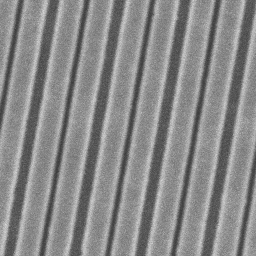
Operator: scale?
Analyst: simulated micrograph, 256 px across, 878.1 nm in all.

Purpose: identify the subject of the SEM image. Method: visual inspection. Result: parallel lines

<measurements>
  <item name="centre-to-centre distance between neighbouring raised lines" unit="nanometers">111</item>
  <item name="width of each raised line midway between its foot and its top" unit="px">22.2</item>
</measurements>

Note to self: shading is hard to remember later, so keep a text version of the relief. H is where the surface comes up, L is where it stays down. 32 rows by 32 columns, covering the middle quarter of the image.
HHLLHHHHHLLLLHHHHHLLHHHHHHLLLHHH
HHLLHHHHHLLLLHHHHHLLHHHHHHLLLHHH
HLLLHHHHHLLLLHHHHHLLHHHHHLLLLHHH
HLLHHHHHHLLLHHHHHHLLHHHHHLLLLHHH
HLLHHHHHLLLLHHHHHHLLHHHHHLLLLHHH
HLLHHHHHLLLLHHHHHLLLHHHHHLLLHHHH
HLLHHHHHLLLLHHHHHLLHHHHHHLLLHHHH
LLLHHHHHLLLLHHHHHLLHHHHHLLLLHHHH
LLHHHHHHLLLLHHHHHLLHHHHHLLLLHHHH
LLHHHHHHLLLHHHHHHLLHHHHHLLLLHHHH
LLHHHHHLLLLHHHHHLLLHHHHHLLLHHHHH
LLHHHHHLLLLHHHHHLLHHHHHHLLLHHHHH
LLHHHHHLLLLHHHHHLLHHHHHHLLLHHHHH
LLHHHHHLLLHHHHHHLLHHHHHLLLLHHHHH
LHHHHHHLLLHHHHHHLLHHHHHLLLLHHHHH
LHHHHHHLLLHHHHHHLLHHHHHLLLLHHHHH
LHHHHHLLLLHHHHHLLLHHHHHLLLHHHHHH
LHHHHHLLLLHHHHHLLHHHHHHLLLHHHHHH
LHHHHHLLLLHHHHHLLHHHHHHLLLHHHHHH
LHHHHHLLLLHHHHHLLHHHHHLLLLHHHHHL
HHHHHHLLLHHHHHHLLHHHHHLLLLHHHHHL
HHHHHLLLLHHHHHHLLHHHHHLLLLHHHHHL
HHHHHLLLLHHHHHLLLHHHHHLLLHHHHHHL
HHHHHLLLLHHHHHLLHHHHHHLLLHHHHHHL
HHHHHLLLLHHHHHLLHHHHHLLLLHHHHHHL
HHHHHLLLLHHHHHLLHHHHHLLLLHHHHHLL
HHHHHLLLHHHHHHLLHHHHHLLLLHHHHHLL
HHHHLLLLHHHHHLLLHHHHHLLLHHHHHHLL
HHHHLLLLHHHHHLLHHHHHHLLLHHHHHHLL
HHHHLLLLHHHHHLLHHHHHHLLLHHHHHHLL
HHHHLLLLHHHHHLLHHHHHLLLLHHHHHLLH
HHHHLLLHHHHHHLLHHHHHLLLLHHHHHLLH